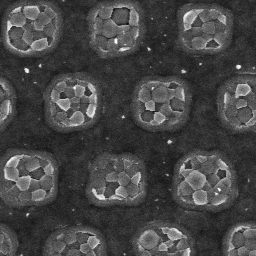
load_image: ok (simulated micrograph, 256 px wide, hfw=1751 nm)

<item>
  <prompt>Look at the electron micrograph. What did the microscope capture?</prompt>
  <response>raised bodies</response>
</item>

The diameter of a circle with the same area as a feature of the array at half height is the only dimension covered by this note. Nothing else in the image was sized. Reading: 391 nm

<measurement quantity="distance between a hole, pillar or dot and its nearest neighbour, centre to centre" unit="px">86.6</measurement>